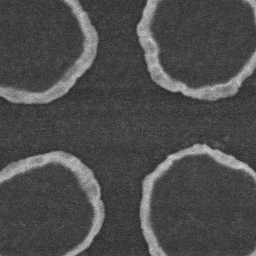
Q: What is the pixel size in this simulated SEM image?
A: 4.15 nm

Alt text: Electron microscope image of raised bodies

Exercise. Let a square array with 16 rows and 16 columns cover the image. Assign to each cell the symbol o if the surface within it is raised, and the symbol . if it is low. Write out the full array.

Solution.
ooooo....ooooooo
ooooo....ooooooo
oooooo...ooooooo
ooooo....ooooooo
ooooo.....ooooo.
oooo.......ooo..
................
................
................
............o...
.oooo.....ooooo.
oooooo...ooooooo
oooooo...ooooooo
oooooo...ooooooo
oooooo...ooooooo
ooooo.....oooooo